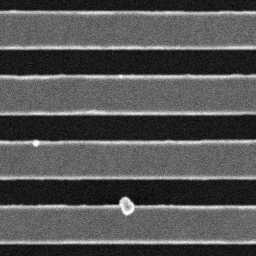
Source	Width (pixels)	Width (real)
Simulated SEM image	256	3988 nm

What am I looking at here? lines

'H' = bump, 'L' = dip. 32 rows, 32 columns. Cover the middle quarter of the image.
LLLLLLLLLLLLLLLLLLLLLLLLLLLLLLLL
LLLLLLLLLLLLLLLLLLLLLLLLLLLLLLLL
LLLLLLLLLLLLLLLLLLLLLLLLLLLLLLLL
HHHHHHHHHHHHHHHHHHHHHHHHHHHHHHHH
HHHHHHHHHHHHHHHHHHHHHHHHHHHHHHHH
HHHHHHHHHHHHHHHHHHHHHHHHHHHHHHHH
HHHHHHHHHHHHHHHHHHHHHHHHHHHHHHHH
HHHHHHHHHHHHHHHHHHHHHHHHHHHHHHHH
HHHHHHHHHHHHHHHHHHHHHHHHHHHHHHHH
HHHHHHHHHHHHHHHHHHHHHHHHHHHHHHHH
HHHHHHHHHHHHHHHHHHHHHHHHHHHHHHHH
HHHHHHHHHHHHHHHHHHHHHHHHHHHHHHHH
LLLLLLLLLLLLLLLLLLLLLLLLLLLLLLLL
LLLLLLLLLLLLLLLLLLLLLLLLLLLLLLLL
LLLLLLLLLLLLLLLLLLLLLLLLLLLLLLLL
LLLLLLLLLLLLLLLLLLLLLLLLLLLLLLLL
LLLLLLLLLLLLLLLLLLLLLLLLLLLLLLLL
LLLLLLLLLLLLLLLLLLLLLLLLLLLLLLLL
LLLLLLLLLLLLLLLLLLLLLLLLLLLLLLLL
HHHHHHHHHHHHHHHHHHHHHHHHHHHHHHHH
HHHHHHHHHHHHHHHHHHHHHHHHHHHHHHHH
HHHHHHHHHHHHHHHHHHHHHHHHHHHHHHHH
HHHHHHHHHHHHHHHHHHHHHHHHHHHHHHHH
HHHHHHHHHHHHHHHHHHHHHHHHHHHHHHHH
HHHHHHHHHHHHHHHHHHHHHHHHHHHHHHHH
HHHHHHHHHHHHHHHHHHHHHHHHHHHHHHHH
HHHHHHHHHHHHHHHHHHHHHHHHHHHHHHHH
HHHHHHHHHHHHHHHHHHHHHHHHHHHHHHHH
HHHHHHHHHHHHHHHHHHHHHHHHHHHHHHHH
LLLLLLLLLLLLLLLLLLLLLLLLLLLLLLLL
LLLLLLLLLLLLLLLLLLLLLLLLLLLLLLLL
LLLLLLLLLLLLLLLLLLLLLLLLLLLLLLLL